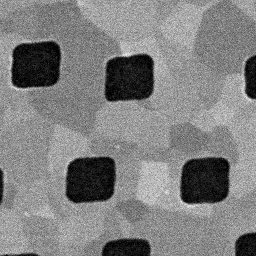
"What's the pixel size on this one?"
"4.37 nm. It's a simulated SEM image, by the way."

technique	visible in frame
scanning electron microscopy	holes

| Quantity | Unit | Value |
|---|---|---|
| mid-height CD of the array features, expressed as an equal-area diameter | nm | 230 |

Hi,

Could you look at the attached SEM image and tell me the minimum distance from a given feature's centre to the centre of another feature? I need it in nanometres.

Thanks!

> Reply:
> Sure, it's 443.